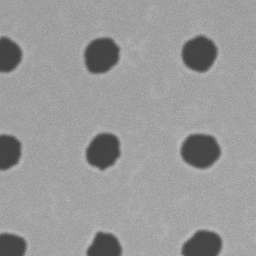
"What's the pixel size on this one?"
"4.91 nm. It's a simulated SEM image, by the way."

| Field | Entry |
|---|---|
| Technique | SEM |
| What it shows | holes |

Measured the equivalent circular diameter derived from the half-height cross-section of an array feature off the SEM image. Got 181 nm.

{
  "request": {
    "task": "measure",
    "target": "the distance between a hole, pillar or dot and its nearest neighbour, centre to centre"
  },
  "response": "472 nm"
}